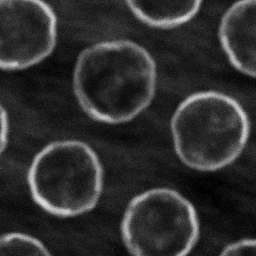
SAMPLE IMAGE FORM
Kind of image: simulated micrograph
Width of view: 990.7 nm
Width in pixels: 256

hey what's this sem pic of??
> raised bodies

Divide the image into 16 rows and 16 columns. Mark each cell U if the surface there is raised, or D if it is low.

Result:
UUUDDDDDUUUUDDDU
UUUDDDDDDDUDDDUU
UUUDDDDDDDDDDDUU
UUUDDUUUUDDDDDUU
DDDDDUUUUUDDDDDU
DDDDDUUUUDDDDDDD
DDDDDUUUUDDUUUUD
DDDDDDDDDDDUUUUD
DDDDDDDDDDDUUUUD
DDDUUUDDDDDUUUUD
DDUUUUDDDDDDDDDD
DDUUUUDDDDDDDDDD
DDUUUUDDDUUDDDDD
DDDDDDDDUUUUDDDD
DDDDDDDDUUUUDDDD
UUUDDDDDUUUUDDUU